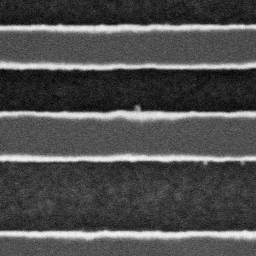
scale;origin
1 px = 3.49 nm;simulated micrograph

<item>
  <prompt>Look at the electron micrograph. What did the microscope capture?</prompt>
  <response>lines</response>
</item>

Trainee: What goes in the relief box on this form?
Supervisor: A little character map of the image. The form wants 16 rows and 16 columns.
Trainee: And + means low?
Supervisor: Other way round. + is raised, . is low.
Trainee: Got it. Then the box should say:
................
................
++++++++++++++++
++++++++++++++++
................
................
................
++++++++++++++++
++++++++++++++++
++++++++++++++++
................
................
................
................
++.+..++.+..++++
++++++++++++++++